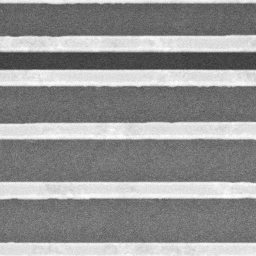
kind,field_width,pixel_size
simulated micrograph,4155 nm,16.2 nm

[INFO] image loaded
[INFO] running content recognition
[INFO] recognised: lines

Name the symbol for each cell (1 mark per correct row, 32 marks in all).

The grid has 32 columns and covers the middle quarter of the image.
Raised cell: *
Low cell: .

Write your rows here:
................................
................................
********************************
********************************
********************************
................................
................................
................................
................................
................................
................................
................................
................................
................................
................................
********************************
********************************
********************************
**.**..*************************
................................
................................
................................
................................
................................
................................
................................
................................
................................
................................
................................
********************************
********************************